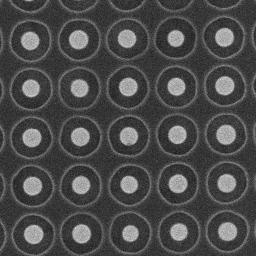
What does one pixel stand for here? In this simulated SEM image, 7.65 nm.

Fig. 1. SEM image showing an array of small figures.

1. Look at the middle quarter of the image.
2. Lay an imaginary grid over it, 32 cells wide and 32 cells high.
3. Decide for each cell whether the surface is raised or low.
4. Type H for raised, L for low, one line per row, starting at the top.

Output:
HHHHHHHHHHHHHHHHHHHHHHHHHHHHHHHH
HHLLLLHHHHHHHLLLLLLHHHHHHLLLLLLH
LLLLLLLLHHHHLLLLLLLLHHHHLLLLLLLL
LLLLLLLLHHHLLLLLLLLLHHHHLLLLLLLL
LLLHHLLLLHHLLLHHHHLLLHHLLLHHHHLL
LLHHHHLLLHHLLLHHHHLLLHHLLLHHHHLL
LLHHHHLLLHHLLLHHHHLLLHHLLLHHHHLL
LLLHHLLLLHHLLLLHHLLLLHHHLLLHHLLL
LLLLLLLLHHHHLLLLLLLLHHHHLLLLLLLL
LLLLLLLLHHHHLLLLLLLLHHHHHLLLLLLL
HLLLLLLHHHHHHHLLLLLHHHHHHHLLLLHH
HHHHHHHHHHHHHHHHHHHHHHHHHHHHHHHH
HHHHHHHHHHHHHHHHHHHHHHHHHHHHHHHH
HHLLLLHHHHHHHHLLLLHHHHHHHLLLLLLH
HLLLLLLHHHHHHLLLLLLLHHHHLLLLLLLL
LLLLLLLLHHHHLLLLLLLLHHHHLLLLLLLL
LLLHHLLLLHHLLLLHHHLLLHHLLLLHHHLL
LLHHHHLLLHHLLLHHHHLLLHHLLLHHHHLL
LLHHHHLLLHHLLLHHHHLLLHHLLLHHHHLL
LLHHHHLLLHHLLLLHHHLLLHHHLLLHHHLL
LLLLLLLLLHHHLLLLLLLLLHHHLLLLLLLL
LLLLLLLLHHHHHLLLLLLLHHHHHLLLLLLL
HLLLLLLHHHHHHHLLLLLHHHHHHHHLLLHH
HHHHHHHHHHHHHHHHHHHHHHHHHHHHHHHH
HHHHHHHHHHHHHHHHHHHHHHHHHHHHHHHH
HHHLLLHHHHHHHHHLLLHHHHHHHHLLLLLH
HLLLLLLHHHHHHLLLLLLLHHHHHLLLLLLL
LLLLLLLLHHHHLLLLLLLLLHHHLLLLLLLL
LLLHHLLLLHHHLLLHHLLLLHHHLLLHHHLL
LLHHHHLLLHHHLLHHHHLLLLHHLLHHHHHL
LLHHHHLLLHHLLLHHHHLLLLHHLLHHHHHL
LLLHHHLLLHHLLLLHHHLLLHHHLLLHHHLL